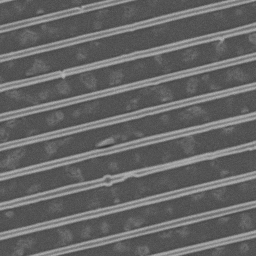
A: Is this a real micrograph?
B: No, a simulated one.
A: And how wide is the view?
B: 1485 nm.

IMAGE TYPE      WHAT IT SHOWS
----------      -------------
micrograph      parallel lines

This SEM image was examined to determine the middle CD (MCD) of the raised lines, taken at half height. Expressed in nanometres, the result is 32.5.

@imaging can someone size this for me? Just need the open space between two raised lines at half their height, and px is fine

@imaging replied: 23.4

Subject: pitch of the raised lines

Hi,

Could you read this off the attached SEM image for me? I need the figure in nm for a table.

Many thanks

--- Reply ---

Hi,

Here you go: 167